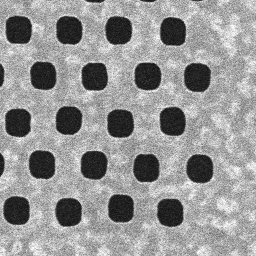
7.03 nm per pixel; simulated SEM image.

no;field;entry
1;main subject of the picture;a regular array of holes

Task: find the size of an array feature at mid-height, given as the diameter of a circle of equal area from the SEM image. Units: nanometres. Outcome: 204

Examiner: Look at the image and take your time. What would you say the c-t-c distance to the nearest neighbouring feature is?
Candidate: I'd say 0.349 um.